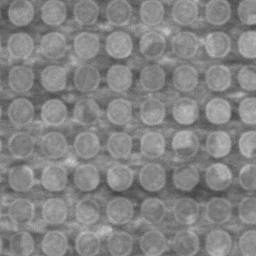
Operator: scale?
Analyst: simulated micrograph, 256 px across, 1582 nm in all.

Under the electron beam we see a regular array of raised bodies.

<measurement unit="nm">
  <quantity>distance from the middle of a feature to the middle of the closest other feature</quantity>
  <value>202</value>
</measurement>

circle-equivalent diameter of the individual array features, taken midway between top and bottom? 152 nanometres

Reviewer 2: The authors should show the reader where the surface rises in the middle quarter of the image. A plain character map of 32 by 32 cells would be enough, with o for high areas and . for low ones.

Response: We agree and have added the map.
.............................oo.
...ooooo....oooo....oooo....oooo
...ooooo...oooooo..oooooo...oooo
...oooooo..oooooo..oooooo..ooooo
...oooooo..oooooo..oooooo...oooo
...ooooo....oooo....oooo....oooo
.....o........o..............oo.
................................
................................
....ooo.....oooo....oooo....oooo
...ooooo...oooooo..oooooo...oooo
...ooooo...oooooo..oooooo...oooo
...oooooo..oooooo..oooooo...oooo
...ooooo...ooooo...oooooo...oooo
....oooo....oooo....ooo......ooo
................................
................................
.....oo......oo......oo......ooo
....oooo....oooo....oooo....oooo
...ooooo...oooooo...ooooo..ooooo
...ooooo...oooooo...ooooo..ooooo
...ooooo...oooooo...ooooo...oooo
....oooo....oooo....oooo....oooo
................................
................................
.....oo..............oo.......oo
...ooooo....oooo....ooooo...oooo
...oooooo..oooooo..oooooo..ooooo
...oooooo..oooooo..oooooo..ooooo
...oooooo..oooooo..oooooo...oooo
...ooooo....oooo....oooo....oooo
.....o..........................